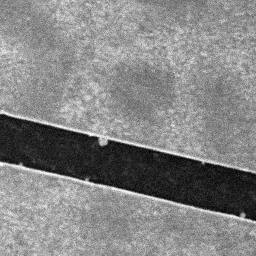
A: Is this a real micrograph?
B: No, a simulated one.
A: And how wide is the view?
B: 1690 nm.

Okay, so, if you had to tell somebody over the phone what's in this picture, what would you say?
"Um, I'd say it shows one or a few lines or trenches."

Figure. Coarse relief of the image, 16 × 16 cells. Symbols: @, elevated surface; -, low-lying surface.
@@@@@@@@@@@@@@@@
@@@@@@@@@@@@@@@@
@@@@@@@@@@@@@@@@
@@@@@@@@@@@@@@@@
@@@@@@@@@@@@@@@@
@@@@@@@@@@@@@@@@
@@@@@@@@@@@@@@@@
--@@@@@@@@@@@@@@
------@@@@@@@@@@
----------@@@@@@
@@-------------@
@@@@@@----------
@@@@@@@@@@------
@@@@@@@@@@@@@@--
@@@@@@@@@@@@@@@@
@@@@@@@@@@@@@@@@